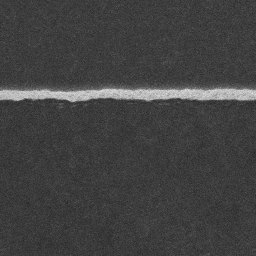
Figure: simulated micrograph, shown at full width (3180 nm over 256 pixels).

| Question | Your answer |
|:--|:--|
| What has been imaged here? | one or a few lines or trenches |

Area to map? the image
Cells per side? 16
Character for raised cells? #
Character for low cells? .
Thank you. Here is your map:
################
################
################
################
################
################
................
................
................
................
................
................
................
................
................
................